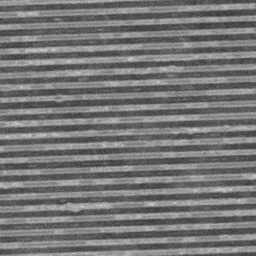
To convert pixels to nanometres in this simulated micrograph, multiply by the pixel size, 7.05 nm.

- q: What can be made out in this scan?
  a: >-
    parallel lines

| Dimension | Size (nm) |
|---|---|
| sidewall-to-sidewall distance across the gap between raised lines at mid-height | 51.9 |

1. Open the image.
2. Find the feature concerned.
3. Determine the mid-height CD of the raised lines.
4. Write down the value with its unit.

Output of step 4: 32.6 nm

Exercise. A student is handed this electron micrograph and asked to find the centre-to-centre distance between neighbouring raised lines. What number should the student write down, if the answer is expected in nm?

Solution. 85.6